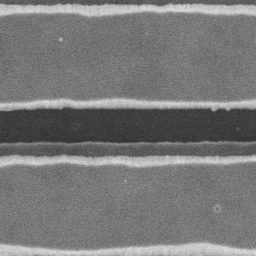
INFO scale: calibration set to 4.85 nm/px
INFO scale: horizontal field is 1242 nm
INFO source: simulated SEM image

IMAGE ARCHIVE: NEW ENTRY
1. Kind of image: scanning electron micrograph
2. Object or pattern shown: lines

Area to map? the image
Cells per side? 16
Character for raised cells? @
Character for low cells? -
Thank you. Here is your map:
@@@@@@@@@@@@@@@@
@@@@@@@@@@@@@@@@
@@@@@@@@@@@@@@@@
@@@@@@@@@@@@@@@@
@@@@@@@@@@@@@@@@
@@@@@@@@@@@@@@@@
@@@@@@@@@@@@@@@@
----------------
----------------
----------------
@@@@@@@@@@@@@@@@
@@@@@@@@@@@@@@@@
@@@@@@@@@@@@@@@@
@@@@@@@@@@@@@@@@
@@@@@@@@@@@@@@@@
@@@@@@@@@@@@@@@@